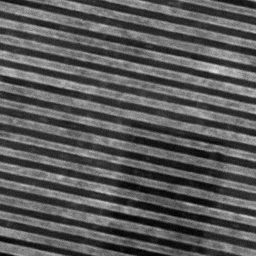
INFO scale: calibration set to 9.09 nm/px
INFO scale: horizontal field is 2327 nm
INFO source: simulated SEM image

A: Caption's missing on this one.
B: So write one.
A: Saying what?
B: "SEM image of parallel lines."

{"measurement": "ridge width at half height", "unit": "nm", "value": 66.7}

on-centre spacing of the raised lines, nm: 142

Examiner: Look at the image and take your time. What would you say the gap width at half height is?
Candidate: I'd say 75.5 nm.